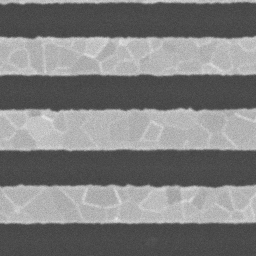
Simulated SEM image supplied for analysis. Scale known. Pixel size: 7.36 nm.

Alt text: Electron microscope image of lines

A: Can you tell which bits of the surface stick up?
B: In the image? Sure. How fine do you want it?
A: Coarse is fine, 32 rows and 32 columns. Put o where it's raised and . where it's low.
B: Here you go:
................................
................................
................................
................................
................................
oooooooooooooooooooooooooooooooo
oooooooooooooooooooooooooooooooo
oooooooooooooooooooooooooooooooo
oooooooooooooooooooooooooooooooo
................................
................................
................................
................................
................................
oooooooooooooooooooooooooooooooo
oooooooooooooooooooooooooooooooo
oooooooooooooooooooooooooooooooo
oooooooooooooooooooooooooooooooo
oooooooooooooooooooooooooooooooo
................................
................................
................................
................................
oooooooooooooooooooooooooooooooo
oooooooooooooooooooooooooooooooo
oooooooooooooooooooooooooooooooo
oooooooooooooooooooooooooooooooo
oooooooooooooooooooooooooooooooo
................................
................................
................................
................................